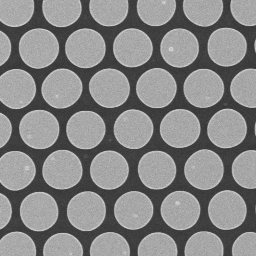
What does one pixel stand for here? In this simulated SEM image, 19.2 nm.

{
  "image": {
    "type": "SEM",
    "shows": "an array of small figures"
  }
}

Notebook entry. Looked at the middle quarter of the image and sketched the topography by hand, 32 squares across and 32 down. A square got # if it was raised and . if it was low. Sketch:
...#####.......###.........###..
#........####........####.......
###.....#######.....######......
####...#########...########....#
####..##########..##########..##
####..##########..##########..##
####..##########..##########..##
####...#########..##########..##
####...#########...########...##
###.....#######.....#######....#
#.........####.......#####......
................##..........##..
...#####......######......######
..#######.....########...#######
.#########...#########..########
.#########...#########..########
.#########...#########..########
.#########...#########..########
.#########...#########...#######
..#######.....#######....#######
...#####.......#####.......####.
................................
##.......#####......######......
####...########....########....#
####...#########...########....#
####...#########...#########..##
#####..#########...#########..##
####...#########...#########..##
####...#########...#########...#
####...########....########....#
##......######.......#####......
................................